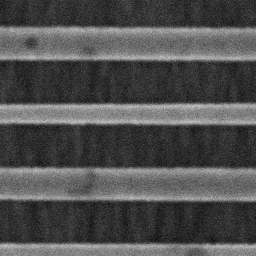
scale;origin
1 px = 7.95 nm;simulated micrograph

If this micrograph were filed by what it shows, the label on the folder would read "lines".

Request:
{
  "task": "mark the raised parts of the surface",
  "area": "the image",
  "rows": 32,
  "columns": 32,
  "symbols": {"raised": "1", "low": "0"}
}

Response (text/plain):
00000000000000000000000000000000
00000000000000000000000000000000
00000000000000000000000000000000
00000000000000000000000000000000
11111111111111111111111111111111
11111111111111111111111111111111
11111111111111111111111111111111
00000000000000000000000000000000
00000000000000000000000000000000
00000000000000000000000000000000
00000000000000000000000000000000
00000000000000000000000000000000
00000000000000000000000000000000
11111111111111111111111111111111
11111111111111111111111111111111
00000000000000000000000000000000
00000000000000000000000000000000
00000000000000000000000000000000
00000000000000000000000000000000
00000000000000000000000000000000
00000000000000000000000000000000
11111111111111111111111111111111
11111111111111111111111111111111
11111111111111111111111111111111
11111111111111111111111111111111
00000000000000000000000000000000
00000000000000000000000000000000
00000000000000000000000000000000
00000000000000000000000000000000
00000000000000000000000000000000
11001100010000000000000000000000
11111111111111111111111111111111